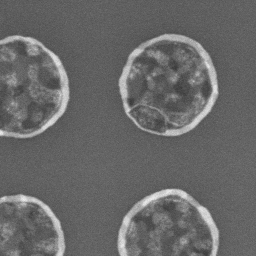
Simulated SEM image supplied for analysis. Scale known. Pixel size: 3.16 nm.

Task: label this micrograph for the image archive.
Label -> raised bodies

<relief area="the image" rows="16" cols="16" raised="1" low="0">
0000000000000000
0000000000000000
1100000000110000
1110000011111000
1111000011111000
1111000011111000
1111000011111000
1110000000110000
0000000000000000
0000000000000000
0000000000000000
0000000000000000
1100000001110000
1110000011111000
1111000011111000
1111000011111000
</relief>